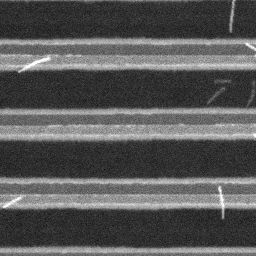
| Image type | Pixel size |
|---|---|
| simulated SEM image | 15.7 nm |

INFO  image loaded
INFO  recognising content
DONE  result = lines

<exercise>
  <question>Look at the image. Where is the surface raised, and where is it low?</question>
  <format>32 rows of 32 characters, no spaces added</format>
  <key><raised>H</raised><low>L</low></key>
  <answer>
LLLLLLLLLLLLLLLLLLLLLLLLLLLLLLLL
LLLLLLLLLLLLLLLLLLLLLLLLLLLLLLLL
LLLLLLLLLLLLLLLLLLLLLLLLLLLLLLLL
LLLLLLLLLLLLLLLLLLLLLLLLLLLLLLLL
LLLLLLLLLLLLLLLLLLLLLLLLLLLLLLLL
HHHHHHHHHHHHHHHHHHHHHHHHHHHHHHHH
HHHHHHHHHHHHHHHHHHHHHHHHHHHHHHHH
HHHHHHHHHHHHHHHHHHHHHHHHHHHHHHHH
LLLLLLLLLLLLLLLLLLLLLLLLLLLLLLLL
LLLLLLLLLLLLLLLLLLLLLLLLLLLLLLLL
LLLLLLLLLLLLLLLLLLLLLLLLLLLLLLLL
LLLLLLLLLLLLLLLLLLLLLLLLLLLLLLLL
LLLLLLLLLLLLLLLLLLLLLLLLLLLLLLLL
LLLLLLLLLLLLLLLLLLLLLLLLLLLLLLLL
HHHHHHHHHHHHHHHHHHHHHHHHHHHHHHHH
HHHHHHHHHHHHHHHHHHHHHHHHHHHHHHHH
HHHHHHHHHHHHHHHHHHHHHHHHHHHHHHHH
LLLLLLLLLLLLLLLLLLLLLLLLLLLLLLLL
LLLLLLLLLLLLLLLLLLLLLLLLLLLLLLLL
LLLLLLLLLLLLLLLLLLLLLLLLLLLLLLLL
LLLLLLLLLLLLLLLLLLLLLLLLLLLLLLLL
LLLLLLLLLLLLLLLLLLLLLLLLLLLLLLLL
LLLLLLLLLLLLLLLLLLLLLLLLLLLLLLLL
HHHHHHHHHHHHHHHHHHHHHHHHHHHHHHHH
HHHHHHHHHHHHHHHHHHHHHHHHHHHHHHHH
HHHHHHHHHHHHHHHHHHHHHHHHHHHHHHHH
LLLLLLLLLLLLLLLLLLLLLLLLLLLLLLLL
LLLLLLLLLLLLLLLLLLLLLLLLLLLLLLLL
LLLLLLLLLLLLLLLLLLLLLLLLLLLLLLLL
LLLLLLLLLLLLLLLLLLLLLLLLLLLLLLLL
LLLLLLLLLLLLLLLLLLLLLLLLLLLLLLLL
LLLLHHLLHHHHLHHHLLLLLHHHHHHHHHHH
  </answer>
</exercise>